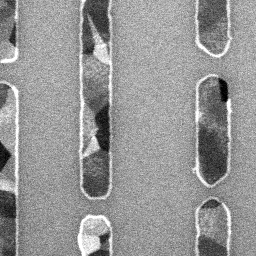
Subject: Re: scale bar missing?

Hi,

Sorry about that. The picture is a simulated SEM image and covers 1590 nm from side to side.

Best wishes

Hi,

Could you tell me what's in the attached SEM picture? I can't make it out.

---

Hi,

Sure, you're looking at one or a few lines or trenches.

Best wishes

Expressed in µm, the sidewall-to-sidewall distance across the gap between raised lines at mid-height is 0.446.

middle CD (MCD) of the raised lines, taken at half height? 186 nanometers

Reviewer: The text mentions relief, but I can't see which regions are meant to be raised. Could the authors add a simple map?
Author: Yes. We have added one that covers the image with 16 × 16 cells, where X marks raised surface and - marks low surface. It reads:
X----XX-----XX--
X----XX-----XX--
X----XX-----XX--
X----XX---------
-----XX---------
X----XX-----XX--
X----XX-----XX--
X----XX-----XX--
X----XX-----XX--
X----XX-----XX--
X----XX-----XX--
X----XX---------
X------------X--
X-----------XX--
X----XX-----XX--
X----XX-----XX--